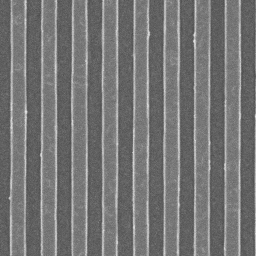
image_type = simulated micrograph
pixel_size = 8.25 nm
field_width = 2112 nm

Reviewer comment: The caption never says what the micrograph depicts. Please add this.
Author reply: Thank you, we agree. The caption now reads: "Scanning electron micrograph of parallel lines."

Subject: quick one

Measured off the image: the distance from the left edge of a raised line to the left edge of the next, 253 nanometres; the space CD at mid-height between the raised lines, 129 nm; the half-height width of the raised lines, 129 nanometers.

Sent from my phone